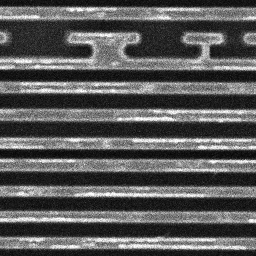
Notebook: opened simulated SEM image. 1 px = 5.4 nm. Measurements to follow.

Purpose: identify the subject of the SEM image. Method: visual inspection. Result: parallel lines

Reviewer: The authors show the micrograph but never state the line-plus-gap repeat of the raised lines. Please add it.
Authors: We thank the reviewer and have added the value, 138 nanometres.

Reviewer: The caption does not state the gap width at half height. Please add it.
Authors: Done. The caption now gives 71.5 nm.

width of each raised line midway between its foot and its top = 13.2 pixels